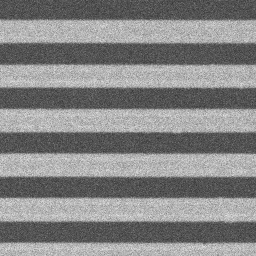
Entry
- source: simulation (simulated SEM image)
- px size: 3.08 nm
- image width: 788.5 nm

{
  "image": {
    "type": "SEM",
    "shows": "parallel lines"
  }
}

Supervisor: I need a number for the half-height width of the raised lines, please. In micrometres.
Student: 0.072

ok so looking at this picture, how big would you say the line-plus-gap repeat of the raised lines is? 137 nanometres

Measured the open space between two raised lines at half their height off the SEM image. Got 64.3 nanometers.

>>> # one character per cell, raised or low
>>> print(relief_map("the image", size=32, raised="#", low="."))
................................
................................
.........####...................
################################
################################
................................
................................
................................
################################
################################
################################
................................
................................
................................
################################
################################
.....................##.........
................................
................................
################################
################################
################################
................................
................................
................................
################################
################################
################################
................................
................................
################################
################################